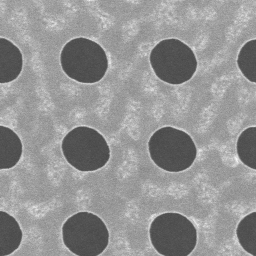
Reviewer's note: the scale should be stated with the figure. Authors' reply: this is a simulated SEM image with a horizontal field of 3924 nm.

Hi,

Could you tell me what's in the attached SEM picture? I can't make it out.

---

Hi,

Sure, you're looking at holes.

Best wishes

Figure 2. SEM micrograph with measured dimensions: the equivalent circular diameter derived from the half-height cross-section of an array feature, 46.2 pixels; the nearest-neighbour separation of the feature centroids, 1340 nm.